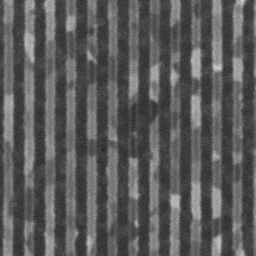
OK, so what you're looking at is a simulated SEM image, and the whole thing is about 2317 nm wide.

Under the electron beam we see parallel lines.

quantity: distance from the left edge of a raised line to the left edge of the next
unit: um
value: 0.189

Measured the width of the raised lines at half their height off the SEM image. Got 67.9 nm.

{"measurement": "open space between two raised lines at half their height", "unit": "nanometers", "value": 121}